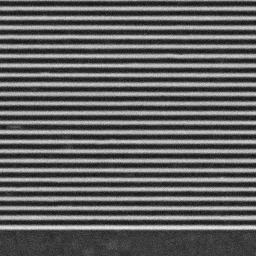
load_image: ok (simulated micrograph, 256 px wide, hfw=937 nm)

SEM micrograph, parallel lines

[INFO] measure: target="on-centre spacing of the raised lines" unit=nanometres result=34.9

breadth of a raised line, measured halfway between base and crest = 12.8 nm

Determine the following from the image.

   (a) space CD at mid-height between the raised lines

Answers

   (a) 0.0224 micrometres